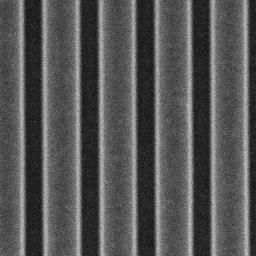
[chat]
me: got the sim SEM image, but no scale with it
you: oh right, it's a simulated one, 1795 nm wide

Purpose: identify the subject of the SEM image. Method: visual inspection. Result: parallel lines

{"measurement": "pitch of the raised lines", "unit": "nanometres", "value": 392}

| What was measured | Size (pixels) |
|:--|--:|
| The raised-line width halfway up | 34.4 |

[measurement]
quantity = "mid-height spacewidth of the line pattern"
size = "154 nm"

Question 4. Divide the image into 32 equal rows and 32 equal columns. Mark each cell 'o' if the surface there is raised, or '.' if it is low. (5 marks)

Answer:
ooo..ooooo...oooo...oooo...oooo.
ooo..ooooo...oooo...oooo...oooo.
ooo..ooooo...oooo...oooo...oooo.
ooo..ooooo...oooo...oooo...oooo.
ooo..ooooo...oooo...oooo...oooo.
ooo...oooo...oooo...oooo...oooo.
ooo...oooo...oooo...oooo...oooo.
ooo...oooo...oooo...oooo...oooo.
ooo...oooo...oooo...oooo...oooo.
ooo...oooo...oooo...oooo...oooo.
ooo...oooo...oooo...oooo...oooo.
ooo...oooo...oooo...oooo...oooo.
ooo...oooo...oooo...oooo...oooo.
ooo...oooo...oooo...oooo...oooo.
ooo...oooo...oooo...oooo...oooo.
ooo...oooo...oooo...oooo...oooo.
ooo...oooo...oooo...oooo...oooo.
ooo...oooo...oooo...oooo...oooo.
ooo...oooo...oooo...oooo...oooo.
ooo...oooo...oooo...oooo...oooo.
ooo...oooo...oooo...oooo...oooo.
ooo...oooo...oooo...oooo...oooo.
ooo...oooo...oooo...oooo...oooo.
ooo...oooo...oooo...oooo...oooo.
ooo...oooo...oooo...oooo...oooo.
ooo...oooo...oooo...oooo...oooo.
ooo...oooo...oooo...oooo...oooo.
ooo...oooo...oooo...oooo...oooo.
ooo...oooo...oooo...oooo...oooo.
ooo...oooo...oooo...oooo...oooo.
ooo...oooo...oooo...oooo...oooo.
ooo...oooo...oooo...oooo...oooo.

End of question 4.